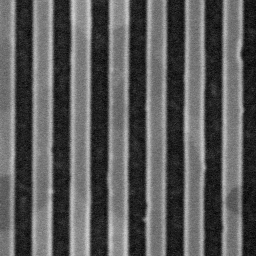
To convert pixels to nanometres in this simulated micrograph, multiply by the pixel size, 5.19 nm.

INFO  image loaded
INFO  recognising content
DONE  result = parallel lines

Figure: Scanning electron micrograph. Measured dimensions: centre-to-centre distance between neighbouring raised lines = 197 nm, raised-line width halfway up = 82.4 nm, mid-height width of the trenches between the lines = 113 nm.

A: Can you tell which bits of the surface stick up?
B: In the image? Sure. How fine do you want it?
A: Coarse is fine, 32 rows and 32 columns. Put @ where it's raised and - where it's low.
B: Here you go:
@@--@@---@@---@@---@@--@@---@@--
@@--@@---@@---@@---@@--@@---@@--
@@--@@---@@---@@---@@--@@---@@--
@@--@@---@@---@@---@@--@@---@@--
@@--@@---@@---@@---@@--@@---@@--
@@--@@---@@---@@---@@--@@---@@--
@@--@@---@@---@@---@@--@@---@@--
@@--@@---@@---@@---@@--@@---@@--
@@--@@---@@---@@---@@--@@---@@--
@@--@@---@@---@@---@@--@@---@@--
@@--@@---@@---@@---@@--@@---@@--
@---@@---@@---@@---@@--@@---@@--
@@--@@---@@---@@---@@--@@---@@--
@@--@@---@@---@@---@@--@@---@@--
@@--@@---@@---@@---@@--@@---@@--
@---@@---@@---@@---@@--@@---@@--
@---@@---@@---@@---@@--@@---@@--
@---@@---@@---@@---@@--@@---@@--
@@--@@---@@---@@---@---@@---@@--
@@--@@---@@---@@---@---@@---@@--
@---@@---@@---@@---@---@@---@@--
@---@@---@@---@@---@---@@---@@--
@---@@---@@---@@---@---@@---@@--
@---@@---@@---@@---@---@@---@@--
@---@@---@@---@@---@---@@---@@--
@---@@---@@---@@---@---@@---@@--
@---@@---@@---@@--@@---@@---@@--
@---@@---@@---@@--@@---@@---@@--
@---@@---@@---@@--@@---@@---@@--
@---@@---@@---@@--@@---@@---@@--
@---@@---@@---@@---@---@@---@@--
@---@@---@@---@@---@---@@---@@--